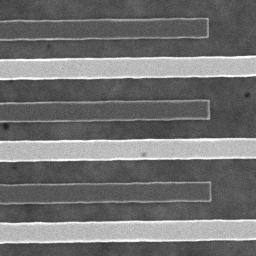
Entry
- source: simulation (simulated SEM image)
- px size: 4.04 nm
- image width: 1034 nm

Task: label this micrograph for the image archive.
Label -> wiring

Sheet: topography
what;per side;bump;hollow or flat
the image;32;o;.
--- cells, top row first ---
................................
................................
...........ooooooooooooooo......
o........ooooooooooooooooo......
.........ooooooooooooooooo......
................................
................................
.o......oooooooooooooooooooo....
.o.....ooooooooooooooooooooo....
......oooooooooooooooooooooo....
................................
................................
................................
..oo..oooooooooooooooooooo......
..oooooooooooooooooooooooo......
................................
................................
....................oooooooooooo
oooooo......oooo...ooooooooooooo
oooooo.....ooooo...ooooooooooooo
................................
................................
................................
oooooooooooooooooooooooooo......
oooooooooooooooooooooooooo......
................................
................................
................................
oooooooooooooooooooooooooooooooo
oooooooooooooooooooooooooooooooo
................................
................................